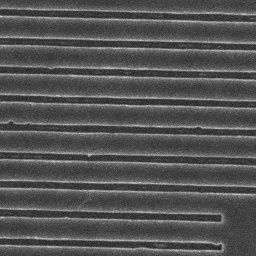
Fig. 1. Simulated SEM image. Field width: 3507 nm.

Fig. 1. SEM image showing parallel lines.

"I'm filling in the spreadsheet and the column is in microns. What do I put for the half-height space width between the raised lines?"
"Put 0.103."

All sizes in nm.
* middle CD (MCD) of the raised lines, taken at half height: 282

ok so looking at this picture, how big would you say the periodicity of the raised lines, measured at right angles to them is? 28.6 pixels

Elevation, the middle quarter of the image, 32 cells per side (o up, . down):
oooooooooooooooooooooooooooooooo
...........................ooooo
................................
oooooooooooooooooooooo..........
oooooooooooooooooooooooooooooooo
oooooooooooooooooooooooooooooooo
oooooooooooooooooooooooooooooooo
oooooooooooooooooooooooooooooooo
................ooo......ooooooo
................................
ooooooooooooooooooooo...........
oooooooooooooooooooooooooooooooo
oooooooooooooooooooooooooooooooo
oooooooooooooooooooooooooooooooo
oooooooooooooooooooooooooooooooo
...................o.ooooooooooo
................................
oooooooooo....ooo...............
oooooooooooooooooooooooooooooooo
oooooooooooooooooooooooooooooooo
oooooooooooooooooooooooooooooooo
oooooooooooooooooooooooooooooooo
....ooooo....ooooooooooooooooooo
................................
ooooooooo.......................
oooooooooooooooooooooooooooooooo
oooooooooooooooooooooooooooooooo
oooooooooooooooooooooooooooooooo
oooooooooooooooooooooooooooooooo
..oooooooooooooooooooooooooooooo
................................
................................